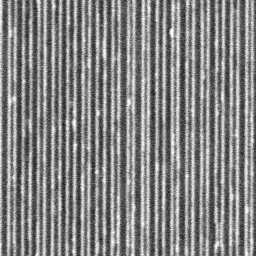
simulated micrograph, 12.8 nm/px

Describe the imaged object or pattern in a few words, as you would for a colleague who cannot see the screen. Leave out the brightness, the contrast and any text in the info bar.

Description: parallel lines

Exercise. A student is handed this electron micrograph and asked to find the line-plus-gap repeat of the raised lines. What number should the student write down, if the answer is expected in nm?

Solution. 190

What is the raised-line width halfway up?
99.5 nm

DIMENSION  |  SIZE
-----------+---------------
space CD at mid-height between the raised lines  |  88.3 nm